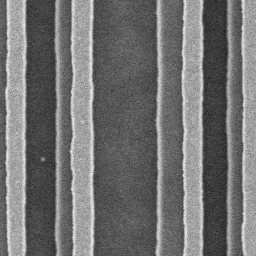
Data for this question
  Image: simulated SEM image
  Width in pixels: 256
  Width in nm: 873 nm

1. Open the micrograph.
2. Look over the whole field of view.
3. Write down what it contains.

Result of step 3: lines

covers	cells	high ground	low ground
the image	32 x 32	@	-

@@@----@@@@---------@@@@@----@@@
@@@----@@@@---------@@@@@----@@@
@@@----@@@@---------@@@@@----@@@
@@@----@@@@---------@@@@@---@@@@
@@@----@@@@---------@@@@@---@@@@
@@@----@@@@---------@@@@@----@@@
@@@----@@@@---------@@@@@----@@@
@@@----@@@@---------@@@@@----@@@
@@@----@@@@---------@@@@@----@@@
@@@----@@@@---------@@@@@---@@@@
@@@----@@@@---------@@@@@---@@@@
@@@----@@@@---------@@@@@---@@@@
@@@----@@@@---------@@@@@---@@@@
@@@----@@@@---------@@@@@---@@@@
@@@----@@@@---------@@@@@---@@@@
@@@----@@@@---------@@@@@---@@@@
@@@----@@@@@--------@@@@@---@@@@
@@@----@@@@@--------@@@@@---@@@@
@@@----@@@@---------@@@@@----@@@
@@@----@@@@---------@@@@@----@@@
@@@----@@@@@--------@@@@@----@@@
@@@----@@@@@--------@@@@@----@@@
@@@----@@@@---------@@@@@----@@@
@@@----@@@@---------@@@@@----@@@
@@@----@@@@---------@@@@@---@@@@
@@@----@@@@@--------@@@@@---@@@@
@@@----@@@@@--------@@@@@---@@@@
@@@----@@@@@--------@@@@@----@@@
@@@----@@@@@--------@@@@@---@@@@
@@@----@@@@@--------@@@@@---@@@@
@@@----@@@@@--------@@@@@---@@@@
@@@----@@@@---------@@@@@---@@@@